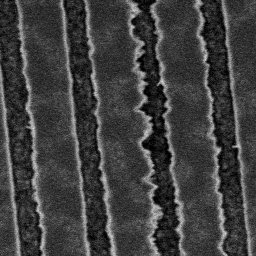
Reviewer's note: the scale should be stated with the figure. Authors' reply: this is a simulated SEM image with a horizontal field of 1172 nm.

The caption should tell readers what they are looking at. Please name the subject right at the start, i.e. one or a few lines or trenches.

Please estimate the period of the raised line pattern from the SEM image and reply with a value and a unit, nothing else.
312 nanometers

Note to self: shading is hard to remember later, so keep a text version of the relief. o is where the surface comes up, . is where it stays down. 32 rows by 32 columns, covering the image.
..oooooo...oooooo..oooooo...oooo
..oooooo...oooooo..oooooo...oooo
..oooooo...ooooo...oooooo...oooo
..oooooo...oooooo...ooooo...oooo
...ooooo...oooooo...ooooo...oooo
...ooooo...ooooooo..ooooo...oooo
...oooooo..ooooooo.ooooooo...ooo
...oooooo..oooooo...oooooo...ooo
...oooooo...ooooo...oooooo...ooo
...oooooo..ooooooo..oooooo...ooo
...oooooo...oooooo..oooooo...ooo
....ooooo...oooooo..oooooo...ooo
....ooooo...oooooo...ooooo...ooo
o..oooooo...oooooo...ooooo...ooo
o...ooooo...oooooo..oooooo...ooo
o...ooooo...ooooooo..oooooo..ooo
o...ooooo...ooooooo..ooooo...ooo
o...oooooo..oooooo...oooooo...oo
o...oooooo..oooooo...oooooo...oo
o...oooooo...oooooo..oooooo...oo
o...oooooo...oooooo..oooooo...oo
o...oooooo...oooooo..oooooo...oo
o...oooooo...oooooo...ooooo...oo
oo..oooooo...oooooo...ooooo...oo
oo..oooooo...oooooo...oooooo..oo
oo...oooooo..oooooo...oooooo...o
oo...oooooo..ooooooo..oooooo...o
oo...oooooo...oooooo...ooooo...o
oo...oooooo..oooooo...oooooo...o
oo...oooooo...ooooo....ooooo...o
oo...oooooo...ooooo...oooooo...o
oo...oooooo...oooooo...ooooo...o